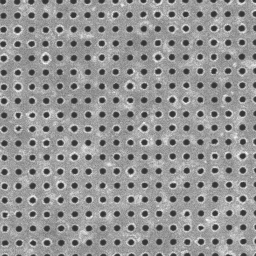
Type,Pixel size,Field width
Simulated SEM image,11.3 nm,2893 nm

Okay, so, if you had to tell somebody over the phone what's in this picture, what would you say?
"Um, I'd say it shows a regular array of holes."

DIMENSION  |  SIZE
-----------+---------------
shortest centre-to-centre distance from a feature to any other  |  156 nanometres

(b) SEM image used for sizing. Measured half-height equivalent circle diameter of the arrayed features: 68.1 nm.